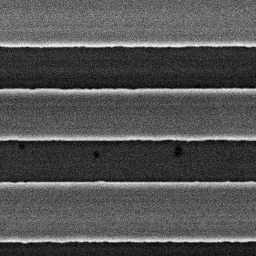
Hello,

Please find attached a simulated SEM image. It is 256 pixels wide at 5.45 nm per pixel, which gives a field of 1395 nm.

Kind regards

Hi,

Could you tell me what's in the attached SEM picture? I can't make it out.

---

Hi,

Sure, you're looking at lines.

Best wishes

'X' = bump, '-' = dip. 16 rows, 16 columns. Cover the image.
XXXXXXXXXXXXXXXX
XXXXXXXXXXXXXXXX
XXXXXXXXXXXXXXXX
----------------
----------------
----------------
XXXXXXXXXXXXXXXX
XXXXXXXXXXXXXXXX
XXXXXXXXXXXXXXXX
----------------
----------------
XXXXXXXXXXXXXXXX
XXXXXXXXXXXXXXXX
XXXXXXXXXXXXXXXX
XXXXXXXXXXXXXXXX
----------------